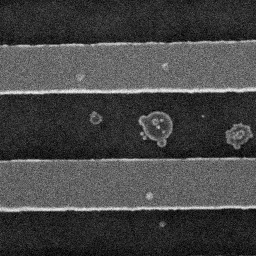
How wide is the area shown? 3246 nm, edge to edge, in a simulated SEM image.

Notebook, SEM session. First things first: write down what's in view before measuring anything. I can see lines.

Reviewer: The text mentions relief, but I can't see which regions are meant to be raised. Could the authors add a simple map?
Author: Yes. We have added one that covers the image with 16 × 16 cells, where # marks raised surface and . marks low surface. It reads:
................
................
................
################
################
################
................
.........#......
................
................
################
################
################
................
................
................